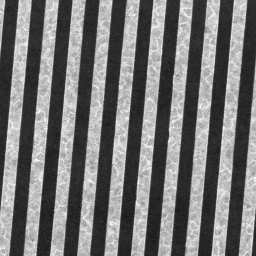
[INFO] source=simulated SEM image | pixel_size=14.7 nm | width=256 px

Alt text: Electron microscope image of parallel lines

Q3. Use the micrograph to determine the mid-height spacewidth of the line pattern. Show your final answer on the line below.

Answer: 14.7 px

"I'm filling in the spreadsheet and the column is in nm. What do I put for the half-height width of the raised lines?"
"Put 180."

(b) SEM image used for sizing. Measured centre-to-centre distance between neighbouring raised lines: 26.8 pixels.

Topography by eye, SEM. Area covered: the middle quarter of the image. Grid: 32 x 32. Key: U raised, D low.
DUUUDDDDUUUDDDUUUDDDDUUUDDDDUUUD
DUUUDDDDUUDDDDUUUDDDDUUUDDDDUUUD
DUUUDDDUUUDDDDUUUDDDDUUUDDDDUUUD
DUUDDDDUUUDDDDUUUDDDDUUUDDDUUUDD
DUUDDDDUUUDDDDUUUDDDDUUUDDDUUUDD
UUUDDDDUUUDDDDUUUDDDDUUUDDDUUUDD
UUUDDDDUUUDDDDUUUDDDDUUDDDDUUUDD
UUUDDDDUUUDDDDUUUDDDDUUDDDDUUUDD
UUUDDDDUUUDDDDUUUDDDUUUDDDDUUUDD
UUUDDDDUUUDDDDUUUDDDUUUDDDDUUUDD
UUUDDDDUUUDDDDUUDDDDUUUDDDDUUUDD
UUUDDDDUUUDDDUUUDDDDUUUDDDDUUUDD
UUUDDDDUUDDDDUUUDDDDUUUDDDDUUUDD
UUUDDDUUUDDDDUUUDDDDUUUDDDDUUUDD
UUUDDDUUUDDDDUUUDDDDUUUDDDDUUDDD
UUDDDDUUUDDDDUUUDDDDUUUDDDDUUDDD
UUDDDDUUUDDDDUUUDDDDUUUDDDUUUDDD
UUDDDDUUUDDDDUUUDDDDUUDDDDUUUDDD
UUDDDDUUUDDDDUUUDDDDUUDDDDUUUDDD
UUDDDDUUUDDDDUUUDDDDUUDDDDUUUDDD
UUDDDDUUUDDDDUUUDDDUUUDDDDUUUDDD
UUDDDDUUUDDDDUUDDDDUUUDDDDUUUDDD
UUDDDDUUUDDDUUUDDDDUUUDDDDUUUDDD
UUDDDDUUUDDDUUUDDDDUUUDDDDUUUDDD
UUDDDDUUDDDDUUUDDDDUUUDDDDUUUDDD
UUDDDUUUDDDDUUUDDDDUUUDDDDUUUDDD
UDDDDUUUDDDDUUUDDDDUUUDDDDUUDDDD
UDDDDUUUDDDDUUUDDDDUUUDDDUUUDDDD
UDDDDUUUDDDDUUUDDDDUUDDDDUUUDDDD
UDDDDUUUDDDDUUUDDDUUUDDDDUUUDDDD
UDDDDUUUDDDDUUUDDDUUUDDDDUUUDDDD
UDDDDUUUDDDDUUUDDDUUUDDDDUUUDDDD